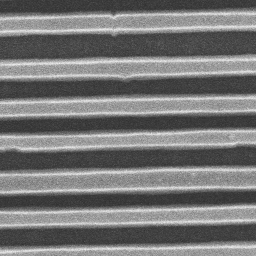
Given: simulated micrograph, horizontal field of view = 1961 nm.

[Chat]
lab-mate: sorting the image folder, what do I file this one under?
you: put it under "parallel lines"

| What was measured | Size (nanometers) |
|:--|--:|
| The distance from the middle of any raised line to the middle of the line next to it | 297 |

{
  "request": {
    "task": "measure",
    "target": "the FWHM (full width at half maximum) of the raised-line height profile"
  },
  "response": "0.136 µm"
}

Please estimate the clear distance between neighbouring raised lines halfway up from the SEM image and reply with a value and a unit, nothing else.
159 nm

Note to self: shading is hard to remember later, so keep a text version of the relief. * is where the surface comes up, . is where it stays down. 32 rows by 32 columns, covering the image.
................................
..........................******
********************************
*******************************.
................................
................................
................................
...........*********************
********************************
**********************..........
................................
................................
...*****************************
********************************
********........................
................................
..................**************
********************************
*************...................
................................
................................
.......*************************
********************************
********************************
................................
................................
********************************
********************************
................................
................................
............................****
********************************